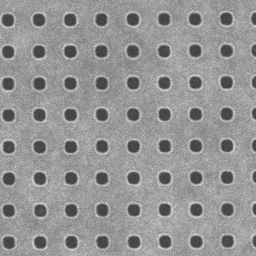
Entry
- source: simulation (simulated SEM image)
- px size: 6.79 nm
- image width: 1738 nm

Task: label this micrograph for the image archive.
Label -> a regular array of holes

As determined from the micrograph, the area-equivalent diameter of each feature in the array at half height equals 91.6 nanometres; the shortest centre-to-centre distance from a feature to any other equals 211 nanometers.